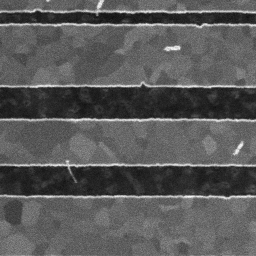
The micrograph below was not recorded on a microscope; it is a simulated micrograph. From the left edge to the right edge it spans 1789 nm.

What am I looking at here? one or a few lines or trenches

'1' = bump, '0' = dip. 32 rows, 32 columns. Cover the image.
11111111111111111111111111111111
00000000000010001000000001000011
00000000000000000000000000000000
11111111111111111111111111111111
11111111111111111111111111111111
11111111111111111111111111111111
11111111111111111111111111111111
11111111111111111111111111111111
11111111111111111111111111111111
11111111111111111111111111111111
11111111111111111111111111111111
00000000000000000000000000000000
00000000000000000000000000000000
00000000000000000000000000000000
00000000000000000000000000000000
11111111111111111111111111111111
11111111111111111111111111111111
11111111111111111111111111111111
11111111111111111111111111111111
11111111111111111111111111111111
11111111111111111111111111111111
00000000000000000000000000000000
00000000000000000000000000000000
00000000000000000000000000000000
10001000000000000000000000000000
11111111111111111111111111111111
11111111111111111111111111111111
11111111111111111111111111111111
11111111111111111111111111111111
11111111111111111111111111111111
11111111111111111111111111111111
11111111111111111111111111111111